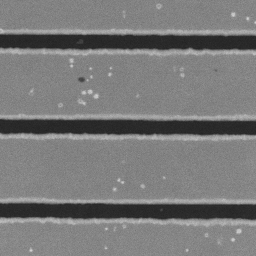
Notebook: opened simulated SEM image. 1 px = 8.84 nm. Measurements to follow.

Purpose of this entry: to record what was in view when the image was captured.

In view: lines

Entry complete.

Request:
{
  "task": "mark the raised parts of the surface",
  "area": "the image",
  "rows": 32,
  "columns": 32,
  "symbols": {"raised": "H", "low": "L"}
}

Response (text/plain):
HHHHHHHHHHHHHHHHHHHHHHHHHHHHHHHH
HHHHHHHHHHHHHHHHHHHHHHHHHHHHHHHH
HHHHHHHHHHHHHHHHHHHHHHHHHHHHHHHH
HHHHHHHHHHHHHHHHHHHHHHHHHHHHHHHH
LLLLLLLLLLLLLLLLLLLLLLLLLLLLLLLL
LLLLLLLLLLLLLLLLLLLLLLLLLLLLLLLL
HHHHHHHHHHHHHHHHHHHHHHHHHHHHHHHH
HHHHHHHHHHHHHHHHHHHHHHHHHHHHHHHH
HHHHHHHHHHHHHHHHHHHHHHHHHHHHHHHH
HHHHHHHHHHHHHHHHHHHHHHHHHHHHHHHH
HHHHHHHHHHHHHHHHHHHHHHHHHHHHHHHH
HHHHHHHHHHHHHHHHHHHHHHHHHHHHHHHH
HHHHHHHHHHHHHHHHHHHHHHHHHHHHHHHH
HHHHHHHHHHHHHHHHHHHHHHHHHHHHHHHH
HHHHHHHHHHHHHHHHHHHHHHHHHHHHHHHH
LLLLLLLLLLLLLLLLLLLLLLLLLLLLLLLL
LLLLLLLLLLLLLLLLLLLLLLLLLLLLLLLL
HHHHHHHHHHHHHHHHHHHHHHHHHHHHHHHH
HHHHHHHHHHHHHHHHHHHHHHHHHHHHHHHH
HHHHHHHHHHHHHHHHHHHHHHHHHHHHHHHH
HHHHHHHHHHHHHHHHHHHHHHHHHHHHHHHH
HHHHHHHHHHHHHHHHHHHHHHHHHHHHHHHH
HHHHHHHHHHHHHHHHHHHHHHHHHHHHHHHH
HHHHHHHHHHHHHHHHHHHHHHHHHHHHHHHH
HHHHHHHHHHHHHHHHHHHHHHHHHHHHHHHH
LLLLLLLLLLLLLLLLLLLLLLLLLLLLLLLL
LLLLLLLLLLLLLLLLLLLLLLLLLLLLLLLL
HHHHHHHHHHHHHHHHHHHHHHHHHHHHHHHH
HHHHHHHHHHHHHHHHHHHHHHHHHHHHHHHH
HHHHHHHHHHHHHHHHHHHHHHHHHHHHHHHH
HHHHHHHHHHHHHHHHHHHHHHHHHHHHHHHH
HHHHHHHHHHHHHHHHHHHHHHHHHHHHHHHH